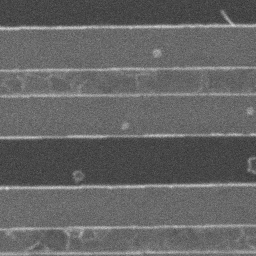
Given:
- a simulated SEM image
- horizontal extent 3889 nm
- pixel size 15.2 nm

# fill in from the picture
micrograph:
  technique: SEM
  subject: lines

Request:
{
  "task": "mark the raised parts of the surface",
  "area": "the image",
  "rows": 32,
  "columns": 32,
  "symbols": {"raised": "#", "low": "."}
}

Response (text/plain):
################################
################################
################################
########........................
................................
................................
................................
................................
........................########
################################
################################
################################
................................
................................
................................
................................
................................
################################
################################
################################
################################
################################
################################
................................
................................
................................
................................
................................
........########################
################################
################################
##########################......